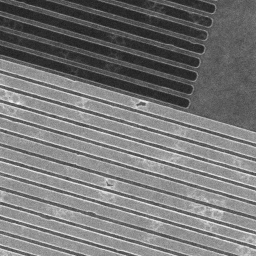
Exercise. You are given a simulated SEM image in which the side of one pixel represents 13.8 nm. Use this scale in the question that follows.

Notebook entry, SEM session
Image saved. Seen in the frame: parallel lines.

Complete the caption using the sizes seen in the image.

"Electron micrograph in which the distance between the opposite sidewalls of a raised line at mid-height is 10.3 pixels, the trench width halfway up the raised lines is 51.3 nanometers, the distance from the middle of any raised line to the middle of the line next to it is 193 nm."